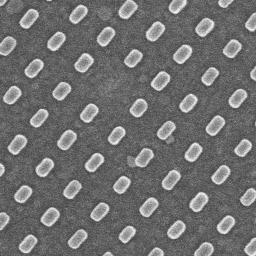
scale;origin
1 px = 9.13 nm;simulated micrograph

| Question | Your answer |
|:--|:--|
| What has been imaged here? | a regular array of raised bodies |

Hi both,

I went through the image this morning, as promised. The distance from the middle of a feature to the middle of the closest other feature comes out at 318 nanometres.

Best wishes